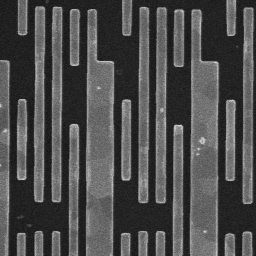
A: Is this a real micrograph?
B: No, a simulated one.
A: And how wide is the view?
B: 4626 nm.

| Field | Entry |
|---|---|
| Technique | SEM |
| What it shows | wiring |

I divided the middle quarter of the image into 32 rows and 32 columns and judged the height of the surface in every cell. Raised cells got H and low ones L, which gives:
LLLLLLHHHHHHLLLLLLLHHLLHHHLLHHLL
LLLLLLHHHHHHLLLLLLLHHLLHHHLLLLLL
LLLLLLHHHHHHLLLLLLLHHLLHHHLLLLLL
LLLLLLHHHHHHLLLLLLLHHLLHHLLLLLLL
LLLLLLHHHHHHLLLLLLLHHLLHHLLLLLLL
LLLLLLHHHHHHLLLLLLLHHLLHHLLLLLLL
LLLLLLHHHHHHLLLLLLLHHLLHHLLLLLLL
LLLLLLHHHHHHLLLLLLLHHLLHHLLLLLLL
LLLLLLHHHHHHLLLLLLLHHLLHHLLLLLLL
LLLLLLHHHHHHLLLHHLLHHLLHHLLLLLLL
LLLLLLHHHHHHLLLHHLLHHLLHHLLLLLLL
LLLLLLHHHHHHLLLHHLLHHLLHHLLLLLLL
LLLLLLHHHHHHLLLHHLLHHLLHHLLLLLLL
LLLLLLHHHHHHLLLHHLLHHLLHHLLLLLLL
LLLLLLHHHHHHLLLHHLLHHLLHHLLLLLLL
LLHLLLHHHHHHLLLHHLLHHLLHHLLLHLLL
LLHHLLHHHHHHLLLHHLLHHLLHHLLLHHLL
LLHHLLHHHHHHLLLHHLLHHLLHHLLLHHLL
LLHHLLHHHHHHLLLHHLLHHLLHHLLLHHLL
LLHHLLHHHHHHLLLHHLLHHLLHHLLLHHLL
LLHHLLHHHHHHLLLHHLLHHLLHHLLLHHLL
LLHHLLHHHHHHLLLHHLLHHLLHHLLLHHLL
LLHHLLHHHHHHLLLHHLLHHLLHHLLLHHLL
LHHHLLHHHHHHLLLHHLLHHLLHHLLLHHLL
LHHHLLHHHHHHLLLHHLLHHLLHHLLLHHLL
LHHHLLHHHHHHLLLHHLLHHLLHHLLLHHLL
LHHHLLHHHHHHLLLHHLLHHLLHHLLLHHLL
LHHHLLHHHHHHLLLHHLLHHLLHHLLLHHLL
LHHHLLHHHHHHLLLHHLLHHLLHHLLLHHLL
LHHLLLHHHHHHLLLLLLLHHLLHHLLLHHLL
LHHLLLHHHHHHLLLLLLLHHLLHHLLLHHLL
LHHLLLHHHHHHLLLLLLLHHLLHHLLLHHLL